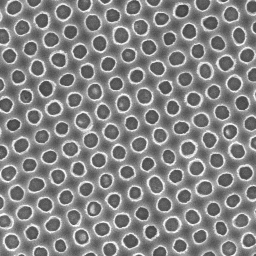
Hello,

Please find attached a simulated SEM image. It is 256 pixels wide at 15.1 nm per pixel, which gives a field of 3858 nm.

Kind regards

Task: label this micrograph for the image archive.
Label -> a regular array of holes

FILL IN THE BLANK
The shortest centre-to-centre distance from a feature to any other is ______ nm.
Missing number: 320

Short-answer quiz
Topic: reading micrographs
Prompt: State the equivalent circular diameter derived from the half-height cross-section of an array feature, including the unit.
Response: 212 nanometres